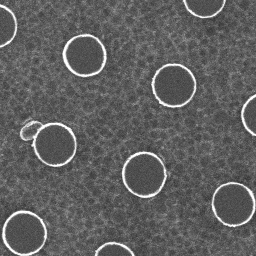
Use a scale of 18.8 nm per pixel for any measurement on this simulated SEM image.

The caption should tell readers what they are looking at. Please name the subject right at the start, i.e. raised bodies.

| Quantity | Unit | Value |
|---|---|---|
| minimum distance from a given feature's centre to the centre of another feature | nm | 1760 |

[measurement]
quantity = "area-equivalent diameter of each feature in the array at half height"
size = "42.9 px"